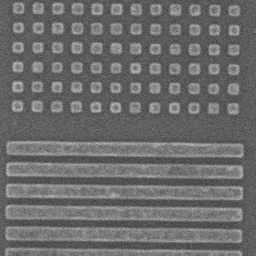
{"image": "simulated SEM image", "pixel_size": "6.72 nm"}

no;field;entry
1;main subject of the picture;groups of lines, slits or small figures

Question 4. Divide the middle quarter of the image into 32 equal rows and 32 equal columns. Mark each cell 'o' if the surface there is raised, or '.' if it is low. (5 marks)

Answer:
..oo...oo...oo...oo...oo...oo..o
..oo...oo...oo...oo...oo...oo..o
................................
................................
................................
..oo...oo...oo...oo...oo...oo..o
..oo...oo...oo...oo...oo...oo..o
................................
................................
................................
..oo...oo...oo...oo...oo...oo..o
..oo...oo...oo...oo...oo...oo..o
................................
................................
................................
................................
................................
................................
................................
................................
oooooooooooooooooooooooooooooooo
oooooooooooooooooooooooooooooooo
oooooooooooooooooooooooooooooooo
................................
................................
oooooooooooooooooooooooooooooooo
oooooooooooooooooo.ooooooooooooo
oooooooooooooooooooooooooooooooo
................................
................................
oooooooooo...oooo...............
oooooooooooooooooooooooooooooooo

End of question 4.